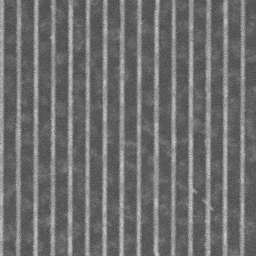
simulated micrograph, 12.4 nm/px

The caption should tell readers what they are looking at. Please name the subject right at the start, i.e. parallel lines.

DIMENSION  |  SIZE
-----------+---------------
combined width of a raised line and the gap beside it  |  0.213 microns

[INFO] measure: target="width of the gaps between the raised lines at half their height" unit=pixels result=14.4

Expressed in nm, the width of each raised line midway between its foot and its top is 38.7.